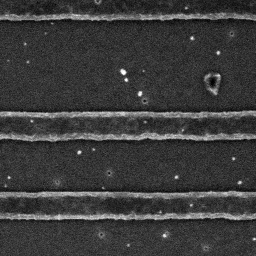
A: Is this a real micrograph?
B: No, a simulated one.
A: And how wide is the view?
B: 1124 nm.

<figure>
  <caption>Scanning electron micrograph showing lines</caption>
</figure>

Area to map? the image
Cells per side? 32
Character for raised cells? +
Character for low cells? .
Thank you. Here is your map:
++++++++++++++++++++++++++++++++
++++++++++++++++++++++++++++++++
................................
................................
................................
................................
................................
................................
................................
................................
................................
................................
................................
................................
++++++.++++++++++++++++..+++++++
++++++++++++++++++++++++++++++++
++++++++++++++++++++++++++++++++
................................
................................
................................
................................
................................
................................
................................
++++++++++++++++++.+.+++++++++++
++++++++++++++++++++++++++++++++
++++++++++++++++++++++++++++++++
................................
................................
................................
................................
................................